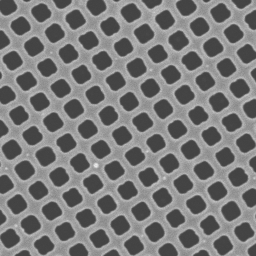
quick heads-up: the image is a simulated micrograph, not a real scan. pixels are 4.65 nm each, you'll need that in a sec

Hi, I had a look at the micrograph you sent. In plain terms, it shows a regular array of holes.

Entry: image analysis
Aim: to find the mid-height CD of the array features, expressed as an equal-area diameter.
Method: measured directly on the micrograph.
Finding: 85.8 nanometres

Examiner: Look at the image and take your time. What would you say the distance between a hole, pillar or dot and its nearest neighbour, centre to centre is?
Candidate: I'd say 114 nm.